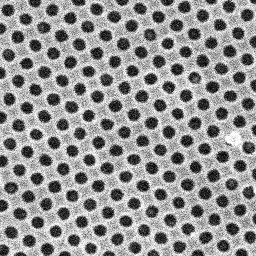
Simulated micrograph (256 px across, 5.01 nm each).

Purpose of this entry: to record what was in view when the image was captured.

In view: a regular array of holes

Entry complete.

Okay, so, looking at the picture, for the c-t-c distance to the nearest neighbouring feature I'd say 96.8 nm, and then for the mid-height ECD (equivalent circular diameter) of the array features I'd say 69.5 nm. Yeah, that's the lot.